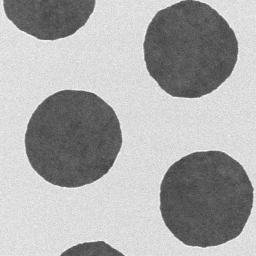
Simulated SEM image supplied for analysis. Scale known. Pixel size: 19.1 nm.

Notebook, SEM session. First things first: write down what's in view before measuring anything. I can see holes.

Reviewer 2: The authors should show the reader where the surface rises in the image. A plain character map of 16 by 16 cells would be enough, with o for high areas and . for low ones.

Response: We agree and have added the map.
......oooo...ooo
o....oooo.....oo
ooooooooo......o
ooooooooo......o
ooooooooo.....oo
oooooooooo....oo
ooo....ooooooooo
oo.....ooooooooo
oo......oooooooo
oo.....ooooo..oo
oo.....oooo....o
ooo...oooo......
oooooooooo......
oooooooooo......
ooooooooooo....o
oooo...ooooooooo